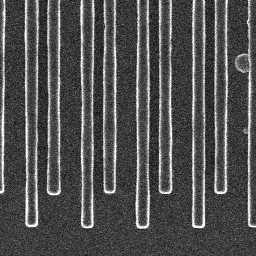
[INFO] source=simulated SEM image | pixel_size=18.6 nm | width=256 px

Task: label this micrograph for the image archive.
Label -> parallel lines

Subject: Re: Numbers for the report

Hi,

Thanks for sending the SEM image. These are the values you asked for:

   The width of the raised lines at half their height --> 0.207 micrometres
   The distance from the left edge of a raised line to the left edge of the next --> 0.503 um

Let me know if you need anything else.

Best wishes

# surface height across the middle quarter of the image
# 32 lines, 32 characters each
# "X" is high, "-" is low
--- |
----XXX---XXX-----XXX---XXX-----
----XXX---XXX-----XXX---XX------
----XXX---XXX-----XXX---XX------
-----XX---XXX-----XXX---XX------
-----XX---XXX-----XXX---XX------
-----XX---XXX-----XXX---XX------
-----XX---XXX-----XXX---XX------
-----XX---XXX-----XXX---XX------
-----XX---XXX-----XXX---XX------
-----XX---XXX-----XXX---XX------
-----XX---XXX-----XXX---XX------
-----XX---XXX-----XXX---XX------
-----XX---XXX-----XXX---XX------
-----XX---XXX-----XXX---XX------
-----XX---XXX-----XXX---XX------
-----XX---XXX-----XXX---XXX-----
-----XX---XXX-----XXX---XXX-----
-----XX---XXX-----XXX---XXX-----
-----XX---XXX-----XXX---XXX-----
-----XX---XXX-----XXX---XXX-----
-----XX---XXX-----XXX---XXX-----
-----XX---XXX-----XXX---XXX-----
-----XX---XXX-----XXX---XXX-----
-----XX---XXX-----XXX---XX------
-----XX---XXX-----XXX---XXX-----
-----XX---XXX-----XXX---XXX-----
-----XX---XXX-----XXX---XXX-----
-----XX---XXX-----XXX---XXX-----
-----XX---XXX-----XXX---XXX-----
-----XX---XXX-----XXX---XXX-----
-----XX---XXX-----XXX---XXX-----
-----XX---XXX-----XXX---XXX-----